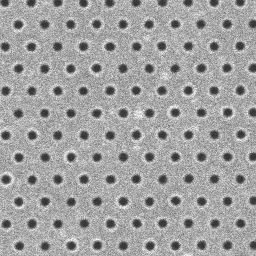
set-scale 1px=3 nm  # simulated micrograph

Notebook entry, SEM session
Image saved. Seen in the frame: a regular array of holes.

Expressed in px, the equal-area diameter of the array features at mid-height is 8.77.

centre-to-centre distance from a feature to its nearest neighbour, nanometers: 76.2